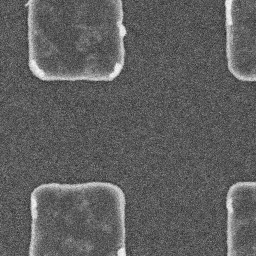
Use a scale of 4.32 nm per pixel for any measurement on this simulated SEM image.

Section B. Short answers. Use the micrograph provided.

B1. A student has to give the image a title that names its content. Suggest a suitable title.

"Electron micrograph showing raised bodies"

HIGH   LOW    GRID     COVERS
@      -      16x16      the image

--@@@@@@------@@
--@@@@@@------@@
--@@@@@@------@@
--@@@@@@------@@
--@@@@@--------@
----------------
----------------
----------------
----------------
----------------
----------------
---@--@--------@
--@@@@@@------@@
--@@@@@@------@@
--@@@@@@------@@
--@@@@@@------@@